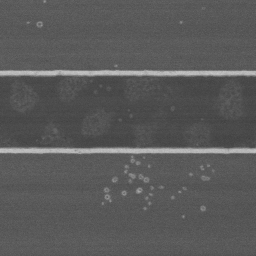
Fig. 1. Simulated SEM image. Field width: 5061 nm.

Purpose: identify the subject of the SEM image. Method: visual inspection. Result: one or a few lines or trenches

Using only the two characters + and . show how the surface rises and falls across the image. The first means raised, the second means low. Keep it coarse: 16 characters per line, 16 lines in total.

++++++++++++++++
++++++++++++++++
++++++++++++++++
++++++++++++++++
++++++++++++++++
................
................
................
................
++++++++++++++++
++++++++++++++++
++++++++++++++++
++++++++++++++++
++++++++++++++++
++++++++++++++++
++++++++++++++++